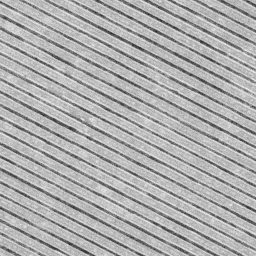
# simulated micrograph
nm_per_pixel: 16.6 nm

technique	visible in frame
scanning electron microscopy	parallel lines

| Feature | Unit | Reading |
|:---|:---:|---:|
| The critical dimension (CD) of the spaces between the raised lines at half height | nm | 62.6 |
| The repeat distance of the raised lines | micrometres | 0.189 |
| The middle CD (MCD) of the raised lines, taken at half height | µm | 0.125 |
